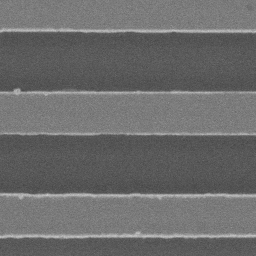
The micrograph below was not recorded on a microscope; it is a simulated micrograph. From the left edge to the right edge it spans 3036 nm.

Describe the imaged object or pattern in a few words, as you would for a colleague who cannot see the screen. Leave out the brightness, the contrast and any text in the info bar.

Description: lines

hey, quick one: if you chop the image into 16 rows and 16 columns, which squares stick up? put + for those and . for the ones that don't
++++++++++++++++
++++++++++++++++
................
................
................
................
++++++++++++++++
++++++++++++++++
................
................
................
................
++++++++++++++++
++++++++++++++++
++++++++++++++++
................